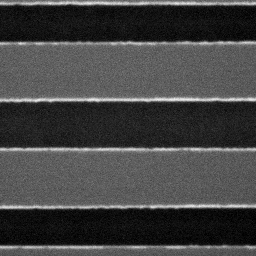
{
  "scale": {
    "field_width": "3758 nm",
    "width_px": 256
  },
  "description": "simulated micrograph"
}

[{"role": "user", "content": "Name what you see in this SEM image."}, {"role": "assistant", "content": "lines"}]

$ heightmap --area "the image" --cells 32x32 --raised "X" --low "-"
XXXXXXXXXXXXXXXXXXX-XXXXXXXXXXXX
--------------------------------
--------------------------------
--------------------------------
--------------------------------
XXXXXXXXXXXXXXXXXXXXXXXXXXXXXXXX
XXXXXXXXXXXXXXXXXXXXXXXXXXXXXXXX
XXXXXXXXXXXXXXXXXXXXXXXXXXXXXXXX
XXXXXXXXXXXXXXXXXXXXXXXXXXXXXXXX
XXXXXXXXXXXXXXXXXXXXXXXXXXXXXXXX
XXXXXXXXXXXXXXXXXXXXXXXXXXXXXXXX
XXXXXXXXXXXXXXXXXXXXXXXXXXXXXXXX
XXXXXXXXXXXXXXXXXXXXXXXXXXXXXXXX
--------------------------------
--------------------------------
--------------------------------
--------------------------------
--------------------------------
--------------------------------
XXXXXXXXXXXXXXXXXXXXXXXXXXXXXXXX
XXXXXXXXXXXXXXXXXXXXXXXXXXXXXXXX
XXXXXXXXXXXXXXXXXXXXXXXXXXXXXXXX
XXXXXXXXXXXXXXXXXXXXXXXXXXXXXXXX
XXXXXXXXXXXXXXXXXXXXXXXXXXXXXXXX
XXXXXXXXXXXXXXXXXXXXXXXXXXXXXXXX
XXXXXXXXXXXXXXXXXXXXXXXXXXXXXXXX
--------------------------------
--------------------------------
--------------------------------
--------------------------------
--------------------------------
XXXXXXXXXXXXXXXXXXXXXXXXXXXXXXXX